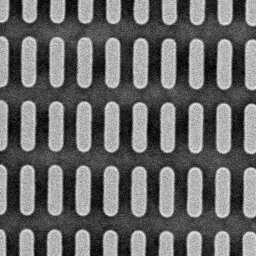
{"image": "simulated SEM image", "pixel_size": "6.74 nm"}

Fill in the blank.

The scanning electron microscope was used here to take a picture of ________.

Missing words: groups of lines, slits or small figures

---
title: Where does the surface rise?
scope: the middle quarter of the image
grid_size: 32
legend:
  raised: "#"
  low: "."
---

....###....###...####....###...#
...####....###...####....###...#
...####....###...####....###...#
...####....###....###....###...#
...####....###....###....###...#
....##.....##.....##.....##.....
................................
................................
................................
................................
....##.....###....##.....##.....
...####...####...####...####...#
...####...####...####...####...#
...####...####...####...####...#
...####...####...####...####...#
...###....####...####...####...#
...###....####...###....####...#
...###....####...###....####...#
...####...####...###....####...#
...####...####...###....####...#
...###....####...###....####...#
....##.....##.....##.....##.....
................................
................................
................................
................................
...###....###....###.....##.....
...###....####...###....###....#
...###....####...###....####...#
...###....####...###....###....#
...###....###....###....###....#
...###....###....###....###....#